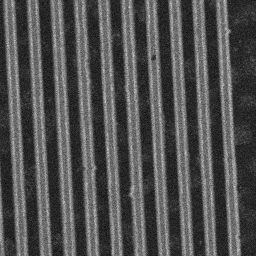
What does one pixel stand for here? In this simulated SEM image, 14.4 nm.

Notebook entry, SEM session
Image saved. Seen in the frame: parallel lines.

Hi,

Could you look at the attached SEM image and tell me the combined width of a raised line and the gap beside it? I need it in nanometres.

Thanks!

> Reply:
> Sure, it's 340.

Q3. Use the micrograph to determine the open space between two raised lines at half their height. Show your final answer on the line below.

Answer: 218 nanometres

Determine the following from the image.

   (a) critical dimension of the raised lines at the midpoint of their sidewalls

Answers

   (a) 121 nm